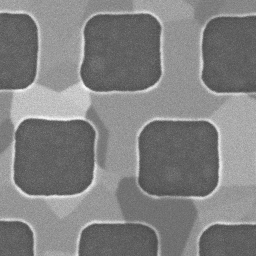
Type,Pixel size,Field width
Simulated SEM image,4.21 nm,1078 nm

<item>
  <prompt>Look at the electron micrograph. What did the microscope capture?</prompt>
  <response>holes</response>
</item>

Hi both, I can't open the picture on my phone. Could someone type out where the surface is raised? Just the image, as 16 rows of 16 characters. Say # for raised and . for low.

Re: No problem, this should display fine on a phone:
################
..###.....###...
..###.....###...
..###.....###...
..###.....###...
..####...####...
################
##...#####.#####
#.....###.....##
#.....###.....##
#.....###.....##
#.....###.....##
################
################
..###.....###...
..###.....##....